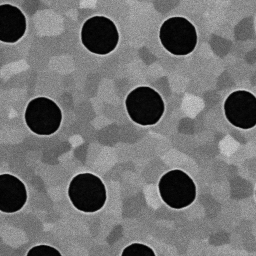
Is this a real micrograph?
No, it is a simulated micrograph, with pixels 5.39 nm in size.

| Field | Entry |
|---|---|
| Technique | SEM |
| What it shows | holes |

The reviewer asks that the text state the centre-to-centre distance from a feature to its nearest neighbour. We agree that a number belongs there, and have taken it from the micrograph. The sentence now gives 0.447 um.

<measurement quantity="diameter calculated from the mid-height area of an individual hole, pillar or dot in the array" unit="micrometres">0.203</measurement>